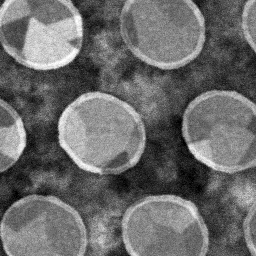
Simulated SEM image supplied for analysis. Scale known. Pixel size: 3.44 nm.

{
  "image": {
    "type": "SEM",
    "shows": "raised bodies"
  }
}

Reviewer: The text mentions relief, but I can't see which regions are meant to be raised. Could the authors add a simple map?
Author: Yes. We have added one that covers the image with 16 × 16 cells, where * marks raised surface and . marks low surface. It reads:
*****...****...*
*****...*****..*
*****...*****..*
.****....***....
................
................
.....***....****
*...*****..*****
**..*****..*****
*...*****...****
.....***.....***
................
.***.....***....
*****...*****..*
*****...*****..*
*****...*****...